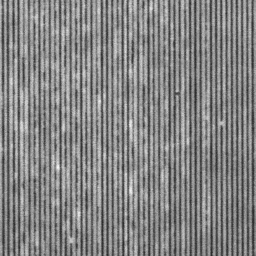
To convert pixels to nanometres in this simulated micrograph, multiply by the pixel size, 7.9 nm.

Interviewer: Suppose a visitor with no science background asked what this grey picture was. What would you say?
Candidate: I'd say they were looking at parallel lines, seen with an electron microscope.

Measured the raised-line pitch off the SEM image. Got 41.2 nanometres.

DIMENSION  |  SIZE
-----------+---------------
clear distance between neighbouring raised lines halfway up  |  15.8 nanometres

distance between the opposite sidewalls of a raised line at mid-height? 23.7 nm